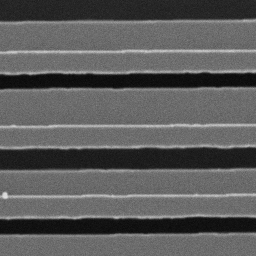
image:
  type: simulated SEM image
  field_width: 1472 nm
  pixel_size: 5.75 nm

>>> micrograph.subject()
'lines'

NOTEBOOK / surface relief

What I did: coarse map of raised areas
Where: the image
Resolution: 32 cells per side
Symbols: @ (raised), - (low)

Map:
--------------------------------
--------------------------------
--------------------------------
@@@@@@@@@@@@@@@@@@@@@@@@@@@@@@@@
@@@@@@@@@@@@@@@@@@@@@@@@@@@@@@@@
@@@@@@@@@@@@@@@@@@@@@@@@@@@@@@@@
@@@@@@@@@@@@@@@@@@@@@@@@@@@@@@@@
@@@@@@@@@@@@@@@@@@@@@@@@@@@@@@@@
@@@@@@@@@@@@@@@@@@@@@@@@@@@@@@@@
--------------------------------
--------------------------------
@@@@@@@@@@@@@@@@@@@@@@@@@@@@@@@@
@@@@@@@@@@@@@@@@@@@@@@@@@@@@@@@@
@@@@@@@@@@@@@@@@@@@@@@@@@@@@@@@@
@@@@@@@@@@@@@@@@@@@@@@@@@@@@@@@@
@@@@@@@@@@@@@@@@@@@@@@@@@@@@@@@@
@@@@@@@@@@@@@@@@@@@@@@@@@@@@@@@@
@@@@@@@@@@@@@@@@@@@@@@@@@@@@@@@@
@@@@--@@@@@---------------------
--------------------------------
--------------------------------
@@@@@@@@@@@@@@@@@@@@@@@@@@@@@@@@
@@@@@@@@@@@@@@@@@@@@@@@@@@@@@@@@
@@@@@@@@@@@@@@@@@@@@@@@@@@@@@@@@
@@@@@@@@@@@@@@@@@@@@@@@@@@@@@@@@
@@@@@@@@@@@@@@@@@@@@@@@@@@@@@@@@
@@@@@@@@@@@@@@@@@@@@@@@@@@@@@@@@
--------------------------------
--------------------------------
@@@@@@@@@@@@@@@@@@@@@@@@@@@@@@@@
@@@@@@@@@@@@@@@@@@@@@@@@@@@@@@@@
@@@@@@@@@@@@@@@@@@@@@@@@@@@@@@@@